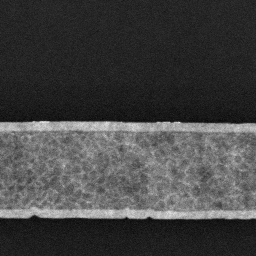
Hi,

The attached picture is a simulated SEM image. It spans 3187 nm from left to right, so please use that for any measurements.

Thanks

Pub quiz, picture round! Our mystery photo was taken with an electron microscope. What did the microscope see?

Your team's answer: one or a few lines or trenches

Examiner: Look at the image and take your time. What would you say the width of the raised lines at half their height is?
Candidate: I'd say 1110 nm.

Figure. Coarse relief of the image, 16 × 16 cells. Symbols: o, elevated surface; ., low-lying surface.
................
................
................
................
................
................
................
................
oooooooooooooooo
oooooooooooooooo
oooooooooooooooo
oooooooooooooooo
oooooooooooooooo
................
................
................